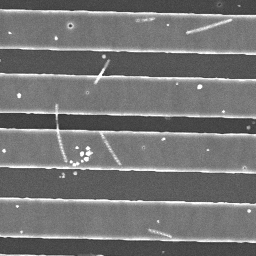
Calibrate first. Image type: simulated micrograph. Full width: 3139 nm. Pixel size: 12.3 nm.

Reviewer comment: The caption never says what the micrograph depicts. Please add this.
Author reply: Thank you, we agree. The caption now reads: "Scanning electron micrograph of lines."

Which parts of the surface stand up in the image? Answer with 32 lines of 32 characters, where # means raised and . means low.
................................
###############.................
################################
################################
################################
################################
.....................###########
................................
................................
#########...#...................
################################
################################
################################
################################
.......................#########
................................
################................
################################
################################
################################
################################
............................####
................................
................................
................................
###############################.
################################
################################
################################
################################
................................
................................